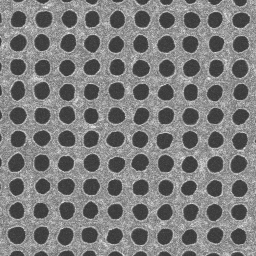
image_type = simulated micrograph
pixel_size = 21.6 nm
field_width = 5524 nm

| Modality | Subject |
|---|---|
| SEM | a regular array of holes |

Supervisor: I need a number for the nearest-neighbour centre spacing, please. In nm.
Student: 508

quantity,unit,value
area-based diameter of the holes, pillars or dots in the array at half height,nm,354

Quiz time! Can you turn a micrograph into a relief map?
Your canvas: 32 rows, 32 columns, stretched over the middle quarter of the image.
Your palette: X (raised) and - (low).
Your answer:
---XX----XX----XX----XXX----XX--
---XX----XX----XX----XXX----XX--
--XXXX--XXXX--XXXX---XXX---XXX--
XXXXXXXXXXXXXXXXXXXXXXXXXXXXXXXX
XXXXXXXXXXXXX-XXXXXXXXXXXXXXXXXX
--XXX---XXXX---XXX---XXX---XXX--
---XX----XX----XX----XXX---XXX--
---XX----XX----XX----XX-----XX--
--XXX---XXXX--XXXX---XXX---XXX--
XXXXXXXXXXXXXXXXXXXXXXXXXXXXXXXX
XXXXXXXXXXXXXXXXXXXXXXXXXXXXXXXX
--XXXX--XXXX--XXXX---XXX---XXX--
---XX----XX----XXX----X-----XX--
---XX----XX----XX----XX----XX---
--XXX---XXXX--XXXX--XXXX---XXX--
XXXXXXXXXXXXXXXXXXXXXXXXXXXXXXXX
XXXXXXXXXXXXXXXXXXXXXXXXXXXXXXXX
--XXX----XX----XX----XXX---XXX--
---XX----XX----XX----XX----XX---
---XX----XX----XX----XX----XXX--
--XXX--XXXXX--XXX---XXX----XXX--
XXXXXXXXXXXXXXXXXXXXXXXXXXXXXXXX
XXXXXXXXXXXXXXXXXXX-XXXXXXXXXXXX
--XXX----XXXX--XX----XXX---XXX--
---XX----XX----XX----XX----XXX--
--XXX----XX----XX----XX----XX---
--XXXX--XXXX--XXXX--XXXX---XXX--
XXXXXXXXXXXXXXXXXXXXXXXXXXXXXXXX
XXXXXXXXXXXXXXXXXXXXXXXXXXXXXXXX
--XXX----XX---XXXX---XXX---XXX--
---XX----XX----XX----XXX---XX---
--XXX----XX---XXX----XXX---XX---